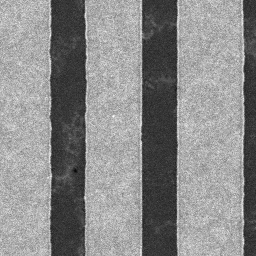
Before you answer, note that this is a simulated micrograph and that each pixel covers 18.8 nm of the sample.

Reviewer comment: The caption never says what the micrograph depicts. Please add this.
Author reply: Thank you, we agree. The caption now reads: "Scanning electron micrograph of one or a few lines or trenches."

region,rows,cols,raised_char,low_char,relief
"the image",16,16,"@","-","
@@@--@@@@--@@@@-
@@@--@@@@--@@@@-
@@@--@@@@--@@@@-
@@@--@@@@--@@@@-
@@@--@@@@--@@@@-
@@@--@@@@--@@@@-
@@@--@@@@--@@@@-
@@@--@@@@--@@@@-
@@@--@@@@--@@@@-
@@@--@@@@--@@@@-
@@@--@@@@--@@@@-
@@@--@@@@--@@@@-
@@@--@@@@--@@@@-
@@@--@@@@--@@@@-
@@@--@@@@--@@@@-
@@@--@@@@--@@@@-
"